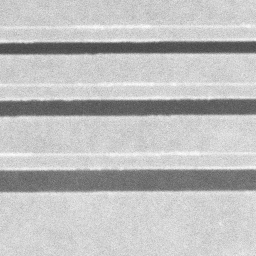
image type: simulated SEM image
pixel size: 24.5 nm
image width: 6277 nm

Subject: lines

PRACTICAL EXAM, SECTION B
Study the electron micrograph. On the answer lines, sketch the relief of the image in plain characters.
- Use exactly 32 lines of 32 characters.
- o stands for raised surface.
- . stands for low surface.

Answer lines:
oooooooooooooooooooooooooooooooo
oooooooooooooooooooooooooooooooo
oooooooooooooooooooooooooooooooo
oooooooooooooooooooooooooooooooo
oooooooooooooooooooooooooooooooo
................................
................................
oooooooooooooooooooooooooooooooo
oooooooooooooooooooooooooooooooo
oooooooooooooooooooooooooooooooo
oooooooooooooooooooooooooooooooo
oooooooooooooooooooooooooooooooo
................................
................................
..................oooooooooooooo
oooooooooooooooooooooooooooooooo
oooooooooooooooooooooooooooooooo
oooooooooooooooooooooooooooooooo
oooooooooooooooooooooooooooooooo
oooooooooooooooooooooooooooooooo
oooooooooooooooooooooooooooooooo
................................
................................
................................
oooooooooooooooooooooooooooooooo
oooooooooooooooooooooooooooooooo
oooooooooooooooooooooooooooooooo
oooooooooooooooooooooooooooooooo
oooooooooooooooooooooooooooooooo
oooooooooooooooooooooooooooooooo
oooooooooooooooooooooooooooooooo
oooooooooooooooooooooooooooooooo